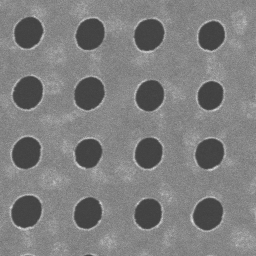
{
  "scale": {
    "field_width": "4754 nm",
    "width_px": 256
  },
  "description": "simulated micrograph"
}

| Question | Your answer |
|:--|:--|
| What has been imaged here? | a regular array of holes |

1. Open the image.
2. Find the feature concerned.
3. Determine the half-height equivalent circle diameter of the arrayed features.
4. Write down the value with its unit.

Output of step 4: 566 nm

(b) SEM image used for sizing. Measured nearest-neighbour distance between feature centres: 1100 nm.